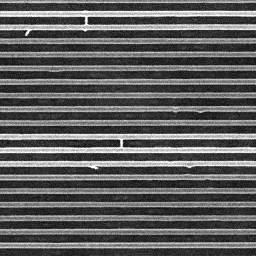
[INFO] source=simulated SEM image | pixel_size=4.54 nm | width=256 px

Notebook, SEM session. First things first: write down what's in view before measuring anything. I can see parallel lines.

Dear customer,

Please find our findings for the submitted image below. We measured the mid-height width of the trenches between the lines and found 38 nm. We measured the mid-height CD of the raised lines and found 21 nanometres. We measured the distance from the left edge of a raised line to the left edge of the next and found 61.8 nm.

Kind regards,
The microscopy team